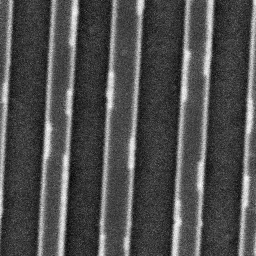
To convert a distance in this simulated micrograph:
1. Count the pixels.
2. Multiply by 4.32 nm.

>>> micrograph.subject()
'one or a few lines or trenches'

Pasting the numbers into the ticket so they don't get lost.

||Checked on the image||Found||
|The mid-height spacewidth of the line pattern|0.18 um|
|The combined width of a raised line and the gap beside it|0.29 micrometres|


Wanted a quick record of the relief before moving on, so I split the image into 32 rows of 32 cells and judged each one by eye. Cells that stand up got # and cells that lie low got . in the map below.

#......###....####.....####.....
#......###....####.....###......
#......###....####.....###......
#.....###.....###......###......
#.....###.....####.....###......
#.....###.....###......###......
#.....###.....###......###.....#
#.....###.....###......###.....#
#.....###.....###......###.....#
#.....###....####......###.....#
#.....###....####......###.....#
#.....###....####......###.....#
#.....###....####......###.....#
#.....###....####......###.....#
#.....###.....###......###.....#
#.....###....####......###.....#
......###....####......###.....#
......###....####.....####.....#
......###....####.....###......#
......###....####.....###......#
.....###.....####.....###......#
.....###.....####.....###......#
.....###.....####.....###......#
.....###.....###......###.....##
.....###.....###......###.....##
.....###.....###......###.....##
.....###.....###......###.....##
.....###.....###......###.....##
.....###.....###......###.....##
.....###.....###......###.....##
.....###.....###......###.....##
.....###....####......###.....##